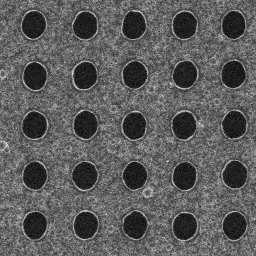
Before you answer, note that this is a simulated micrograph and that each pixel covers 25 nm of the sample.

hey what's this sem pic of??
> a regular array of holes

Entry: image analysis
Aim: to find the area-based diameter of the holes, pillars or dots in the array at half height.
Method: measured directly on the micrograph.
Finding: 658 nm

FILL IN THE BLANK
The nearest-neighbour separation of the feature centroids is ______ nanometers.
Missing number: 1230